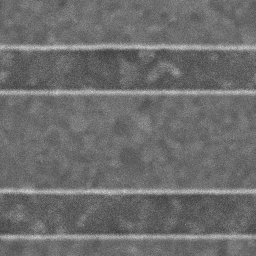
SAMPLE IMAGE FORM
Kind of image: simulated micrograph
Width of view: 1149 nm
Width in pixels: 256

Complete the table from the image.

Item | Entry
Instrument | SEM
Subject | one or a few lines or trenches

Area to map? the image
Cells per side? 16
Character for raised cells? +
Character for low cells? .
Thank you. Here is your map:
++++++++++++++++
++++++++++++++++
++++++++++++++++
................
................
................
++++++++++++++++
++++++++++++++++
++++++++++++++++
++++++++++++++++
++++++++++++++++
++++++++++++++++
................
................
................
++++++++++++++++